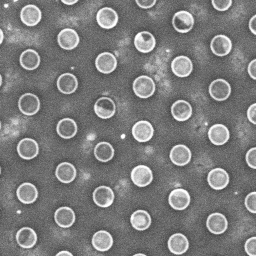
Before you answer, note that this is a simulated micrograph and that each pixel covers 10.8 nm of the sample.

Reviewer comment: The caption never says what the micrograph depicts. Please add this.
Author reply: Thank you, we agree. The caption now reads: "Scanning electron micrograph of a regular array of raised bodies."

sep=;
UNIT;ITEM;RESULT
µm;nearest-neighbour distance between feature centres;0.472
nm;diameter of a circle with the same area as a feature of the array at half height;218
